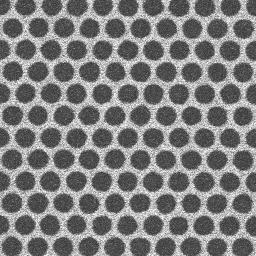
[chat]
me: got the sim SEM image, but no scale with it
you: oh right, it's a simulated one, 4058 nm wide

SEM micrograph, a regular array of holes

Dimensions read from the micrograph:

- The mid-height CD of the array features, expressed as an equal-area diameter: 322 nanometers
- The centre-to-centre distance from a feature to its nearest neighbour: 398 nanometers